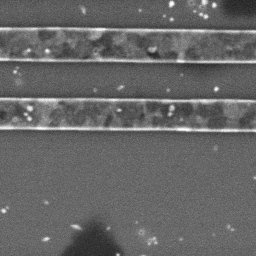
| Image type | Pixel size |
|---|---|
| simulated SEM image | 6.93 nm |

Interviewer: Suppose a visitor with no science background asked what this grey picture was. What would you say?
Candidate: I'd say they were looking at wiring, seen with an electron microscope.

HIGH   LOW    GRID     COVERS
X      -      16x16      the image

----------------
----------------
XXXXXXXXXXXXXXXX
XXXXXXXXXXXXXXXX
----------------
----------------
XXXXXXXXXXXXXXXX
XXXXXXXXXXXXXXXX
----------------
----------------
----------------
----------------
----------------
----------------
----------------
----------------